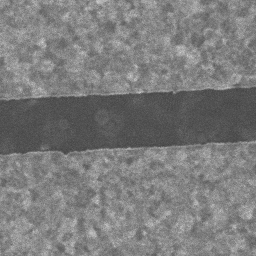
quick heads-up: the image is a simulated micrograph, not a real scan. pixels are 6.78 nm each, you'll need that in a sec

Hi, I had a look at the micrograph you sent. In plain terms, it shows one or a few lines or trenches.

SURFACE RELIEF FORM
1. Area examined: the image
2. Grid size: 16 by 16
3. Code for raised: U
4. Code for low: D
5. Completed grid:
UUUUUUUUUUUUUUUU
UUUUUUUUUUUUUUUU
UUUUUUUUUUUUUUUU
UUUUUUUUUUUUUUUU
UUUUUUUUUUUUUUUU
UUUUUUUUUUUUUUDD
DDDDDDDDDDDDDDDD
DDDDDDDDDDDDDDDD
DDDDDDDDDDDDDDDD
DDUDDUUUUUUUUUUU
UUUUUUUUUUUUUUUU
UUUUUUUUUUUUUUUU
UUUUUUUUUUUUUUUU
UUUUUUUUUUUUUUUU
UUUUUUUUUUUUUUUU
UUUUUUUUUUUUUUUU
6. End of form